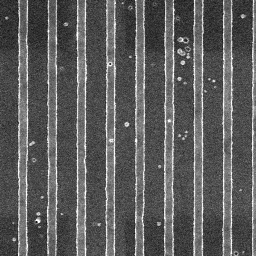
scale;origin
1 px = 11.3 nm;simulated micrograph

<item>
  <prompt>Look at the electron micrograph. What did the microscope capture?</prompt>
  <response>parallel lines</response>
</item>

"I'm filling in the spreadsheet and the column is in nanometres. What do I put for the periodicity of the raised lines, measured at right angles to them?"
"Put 332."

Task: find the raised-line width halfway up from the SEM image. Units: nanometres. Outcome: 96.5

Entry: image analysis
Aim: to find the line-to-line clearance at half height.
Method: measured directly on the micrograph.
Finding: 237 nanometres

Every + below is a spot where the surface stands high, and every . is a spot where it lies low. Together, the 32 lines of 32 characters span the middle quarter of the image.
....++.....++.....++.....++.....
....++.....++.....++.....++.....
...+++.....++.....++.....++.....
...+++.....++.....++.....++.....
....+......++.....++.....++.....
....+......++.....++.....++.....
...++......++.....++.....++.....
...++......++.....++.....++.....
....+......++.....++.....++.....
...++......++.....++.....++.....
...++......++.....++.....++.....
...++......++.....++.....++.....
...++......++.....++.....++.....
...++......++.....++.....++.....
...++......++.....++.....++.....
...++......++.....++.....++.....
...++......++.....++.....++.....
...++......++.....++.....++.....
...++......++.....++.....++.....
...++......++.....++.....++.....
...++......++.....++.....++.....
...++......++.....++.....++.....
...++......++.....++.....++.....
...++......++.....++.....++.....
...++......++.....++.....++.....
...++......++.....++.....++.....
...++......++.....++.....++.....
...++......++.....++.....++.....
...++......++.....++.....++.....
...++......++.....++.....++.....
...++......++.....++.....++.....
...++.....+++.....++.....++.....